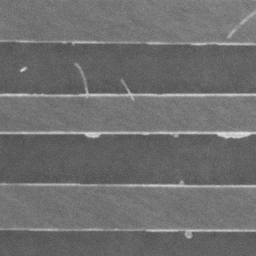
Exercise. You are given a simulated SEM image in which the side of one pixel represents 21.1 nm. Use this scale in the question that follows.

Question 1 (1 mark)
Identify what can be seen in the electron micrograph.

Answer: lines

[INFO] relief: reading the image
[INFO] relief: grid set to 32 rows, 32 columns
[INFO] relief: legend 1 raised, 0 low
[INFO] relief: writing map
11111111111111111111111111111111
11111111111111111111111111111111
11111111111111111111111111111111
11111111111111111111111111111111
11111111111111111111111111111111
00000000000000000000000000011111
00000000000000000000000000000000
00000000000000000000000000000000
00000000000000000000000000000000
00000000000000000000000000000000
00000000000000000000000000000000
00000000000000000000000000000000
11111111111111111111111111111111
11111111111111111111111111111111
11111111111111111111111111111111
11111111111111111111111111111111
11111111111111111111111111111111
00000000000000000000000000000000
00000000000000000000000000000000
00000000000000000000000000000000
00000000000000000000000000000000
00000000000000000000000000000000
00000000000000000000000000000000
11111111111111111111111111111111
11111111111111111111111111111111
11111111111111111111111111111111
11111111111111111111111111111111
11111111111111111111111111111111
11111111111111111111111111111111
00000000000000000000000000000000
00000000000000000000000000000000
00000000000000000000000000000000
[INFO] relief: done